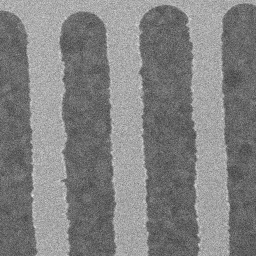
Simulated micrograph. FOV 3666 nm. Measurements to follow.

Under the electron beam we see one or a few lines or trenches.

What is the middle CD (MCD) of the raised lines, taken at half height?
50 px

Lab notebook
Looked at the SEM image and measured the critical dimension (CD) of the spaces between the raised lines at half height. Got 436 nm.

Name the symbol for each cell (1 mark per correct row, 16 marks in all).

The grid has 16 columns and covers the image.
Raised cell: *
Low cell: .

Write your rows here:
..........*...**
*...***..***..**
**..***..***..**
**..***..***..**
**..***..***..**
**..***..***..**
**..***..***..**
**..***..***..**
**..***..***..**
**..***..***..**
**..***..***..**
**..***..***..**
**..***..***..**
**..***..***..**
**..***..***..**
**..***..***..**